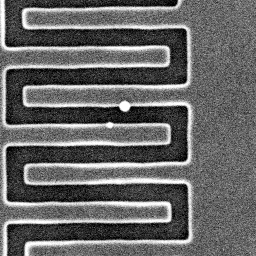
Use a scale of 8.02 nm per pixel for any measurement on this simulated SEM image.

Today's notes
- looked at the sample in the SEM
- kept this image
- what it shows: groups of lines, slits or small figures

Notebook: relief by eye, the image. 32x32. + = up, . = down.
......................++++++++++
...+++++++++++++++++++++++++++++
...+++++++++++++++++++++++++++++
...++++++++++++..++++..+++++++++
........................++++++++
+.......................++++++++
+++++++++++++++++++++...++++++++
+++++++++++++++++++++...++++++++
+++....++...............++++++++
+.......................++++++++
+......................+++++++++
+..+++++++++++++++++++++++++++++
+..+++++++++++++++++++++++++++++
+..............+.......+++++++++
+.......................++++++++
+............+..........++++++++
+++++++++++++++++++++...++++++++
+++++++++++++++++++++...++++++++
+.......................++++++++
+.......................++++++++
+..................+++++++++++++
+..+++++++++++++++++++++++++++++
+..+++++++++++++++++++++++++++++
+.......................++++++++
+.......................++++++++
+++.+++++++++++++.+++...++++++++
+++++++++++++++++++++...++++++++
+++++++++++++++++++++...++++++++
+.......................++++++++
+.......................++++++++
+...++++++++++++++++++++++++++++
+..+++++++++++++++++++++++++++++